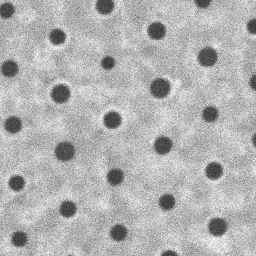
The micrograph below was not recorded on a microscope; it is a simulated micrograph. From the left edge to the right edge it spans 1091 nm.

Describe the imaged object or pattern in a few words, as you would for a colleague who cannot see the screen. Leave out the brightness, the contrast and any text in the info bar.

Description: a regular array of holes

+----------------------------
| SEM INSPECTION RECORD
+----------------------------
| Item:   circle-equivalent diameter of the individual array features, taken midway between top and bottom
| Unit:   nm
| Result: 76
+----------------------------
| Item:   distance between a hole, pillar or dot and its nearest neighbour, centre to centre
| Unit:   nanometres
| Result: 240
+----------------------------